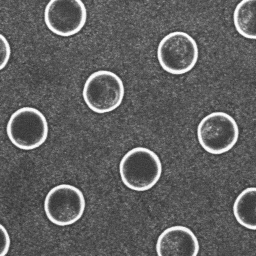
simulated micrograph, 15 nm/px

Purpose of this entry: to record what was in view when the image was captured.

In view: raised bodies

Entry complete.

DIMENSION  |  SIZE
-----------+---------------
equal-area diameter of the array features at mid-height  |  577 nanometers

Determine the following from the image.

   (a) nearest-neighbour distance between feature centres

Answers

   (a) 1.26 µm